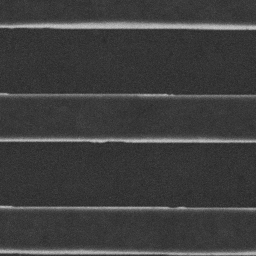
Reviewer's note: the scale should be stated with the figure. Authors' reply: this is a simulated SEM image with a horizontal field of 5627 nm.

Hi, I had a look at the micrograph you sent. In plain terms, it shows lines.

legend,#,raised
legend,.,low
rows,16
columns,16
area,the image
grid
################
################
................
................
................
................
################
################
################
................
................
................
................
################
################
################